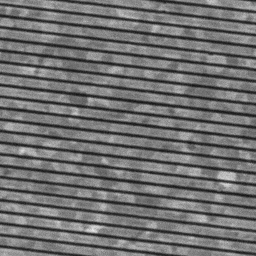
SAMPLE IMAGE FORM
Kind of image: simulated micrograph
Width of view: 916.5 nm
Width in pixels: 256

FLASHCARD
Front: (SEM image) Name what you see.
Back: parallel lines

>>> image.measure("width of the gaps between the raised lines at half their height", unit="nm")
12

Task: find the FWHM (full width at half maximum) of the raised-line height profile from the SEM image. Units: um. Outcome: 0.027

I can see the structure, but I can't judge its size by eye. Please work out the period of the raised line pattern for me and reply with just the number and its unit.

41 nanometers